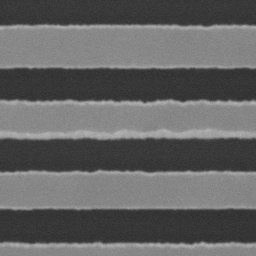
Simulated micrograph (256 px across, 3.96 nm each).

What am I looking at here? lines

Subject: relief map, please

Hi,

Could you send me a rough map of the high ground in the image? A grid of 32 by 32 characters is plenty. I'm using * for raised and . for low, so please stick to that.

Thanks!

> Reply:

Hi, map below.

................................
................................
................................
********************************
********************************
********************************
********************************
********************************
**.***.***********************.*
................................
................................
................................
................................
********************************
********************************
********************************
********************************
................................
................................
................................
................................
..****...*..******.....*..***...
********************************
********************************
********************************
********************************
................................
................................
................................
................................
***********************.********
********************************